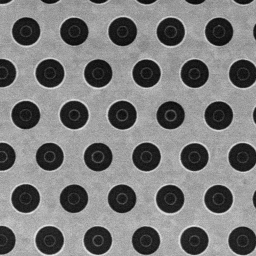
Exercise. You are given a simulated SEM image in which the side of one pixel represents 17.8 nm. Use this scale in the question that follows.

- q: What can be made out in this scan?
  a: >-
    an array of small figures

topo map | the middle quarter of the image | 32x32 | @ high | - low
@@@@@-------@@@@@-------@@@@@---
@@@@@---@@--@@@@@---@@--@@@@@---
@@@@@--@@@--@@@@@--@@@--@@@@@--@
@@@@@---@---@@@@@---@---@@@@@---
@@@@@-------@@@@@@------@@@@@@--
@@@@@@-----@@@@@@@@----@@@@@@@@-
@@@@@@@@@@@@@@@@@@@@@@@@@@@@@@@@
@@@@@@@@@@@@@@@@@@@@@@@@@@@@@@@@
@@@@@@@@@@@@@@@@@@@@@@@@@@@@@@@@
-----@@@@@@@@---@@@@@@@@@---@@@@
------@@@@@-------@@@@@@-----@@@
------@@@@@-------@@@@@-------@@
-@@@--@@@@@--@@@--@@@@@--@@@--@@
--@---@@@@@--@@@--@@@@@---@@--@@
------@@@@@-------@@@@@-------@@
-----@@@@@@@-----@@@@@@@-----@@@
@@-@@@@@@@@@@@-@@@@@@@@@@@-@@@@@
@@@@@@@@@@@@@@@@@@@@@@@@@@@@@@@@
@@@@@@@@@@@@@@@@@@@@@@@@@@@@@@@@
@@@@@@@@@@@@@@@@@@@@-@@@@@@@@@@@
@@@@@@-----@@@@@@@-----@@@@@@@--
@@@@@-------@@@@@-------@@@@@---
@@@@@--@@@--@@@@@--@@@--@@@@@---
@@@@@--@@@--@@@@@--@@@--@@@@@--@
@@@@@-------@@@@@-------@@@@@---
@@@@@@-----@@@@@@@------@@@@@@--
@@@@@@@---@@@@@@@@@---@@@@@@@@@-
@@@@@@@@@@@@@@@@@@@@@@@@@@@@@@@@
@@@@@@@@@@@@@@@@@@@@@@@@@@@@@@@@
@@@@@@@@@@@@@@@@@@@@@@@@@@@@@@@@
@---@@@@@@@@@---@@@@@@@@@---@@@@
------@@@@@-------@@@@@@-----@@@